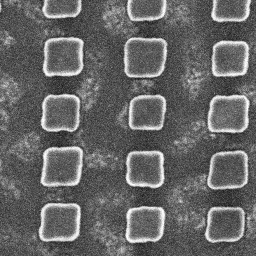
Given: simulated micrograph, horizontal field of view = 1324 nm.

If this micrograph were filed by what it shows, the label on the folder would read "a regular array of raised bodies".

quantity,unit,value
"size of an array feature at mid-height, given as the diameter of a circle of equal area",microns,0.207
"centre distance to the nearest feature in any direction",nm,285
